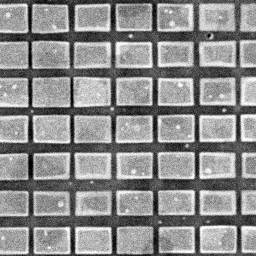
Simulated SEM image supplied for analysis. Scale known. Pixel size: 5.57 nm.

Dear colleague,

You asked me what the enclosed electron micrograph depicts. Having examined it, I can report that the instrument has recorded wiring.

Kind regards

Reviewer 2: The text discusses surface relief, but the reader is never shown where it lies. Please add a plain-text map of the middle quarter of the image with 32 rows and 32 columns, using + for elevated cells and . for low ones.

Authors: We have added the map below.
+..+++++.......++++++...........
................................
................................
+..+............................
+.+++++++++...++++++++..++++++++
+.+++++++++...++++++++..++++++++
+.+++++++++...++++++++..++++++++
+.+++++++++..+++++++++..++++++++
+.+++++++++..+++++++++..++++++++
+..+++++++++.+++++++++..++++++++
+..+............................
................................
................................
+..+++++++++.+++++++++..++++++++
+..+++++++++.+++++++++..++++++++
+..+++++++++.+++++++++..++++++++
+..+++++++++.+++++++++..++++++++
+..+++++++++.+++++++++..++++++++
+..+++++++++.+++++++++..++++++++
................................
................................
................................
........................++++++++
+..++++++++...++++++++..++++++++
+..++++++++...++++++++..++++++++
+..++++++++...++++++++..++++++++
+..++++++++...++++++++..++++++++
+..++++++++...++++++++..++++++++
................................
................................
................................
................................